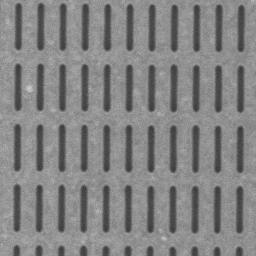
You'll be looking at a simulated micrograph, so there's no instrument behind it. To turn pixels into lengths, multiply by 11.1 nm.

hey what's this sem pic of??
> groups of lines, slits or small figures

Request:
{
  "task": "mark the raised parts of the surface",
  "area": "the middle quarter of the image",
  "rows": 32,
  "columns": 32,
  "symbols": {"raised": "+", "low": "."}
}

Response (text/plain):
.+++..++++..+++..++++..++++.++++
.+++..++++..+++...+++..+++...+++
.+++..++++..+++...+++..+++...+++
.+++..++++..+++...+++..+++...+++
.+++..++++..+++...+++..+++...+++
.+++..++++..+++...+++..+++...+++
.+++..++++..+++..++++..+++...+++
.+++..++++..+++..++++..+++...+++
.+++..++++..+++..++++..+++...+++
.+++..++++..+++..++++..+++...+++
.+++..++++..+++..++++..+++...+++
++++..++++..+++..++++..++++.++++
++++++++++++++++++++++++++++++++
++++++++++++++++++++++++++++++++
++++++++++++++++++++++++++++++++
++++..++++..+++..++++..++++.++++
.+++..++++..+++..++++..+++...+++
.+++..++++..+++..++++..+++...+++
.+++..++++..+++..++++..+++..++++
.+++..++++..+++..++++..+++..++++
.+++..++++..+++..++++..+++..++++
.+++..++++..+++..++++..+++..++++
.+++..++++..+++..++++..+++...+++
.+++..++++..+++..++++..+++...+++
.+++..++++..+++..++++..+++...+++
.+++..+++...+++..++++..+++...+++
++++..++++.++++..++++..+++..++++
++++++++++++++++++++++++++++++++
++++++++++++++++++++++++++++++++
++++++++++++++++++++++++++++++++
++++..++++.++++..++++.+++++.++++
.+++..+++...+++..++++..+++..++++